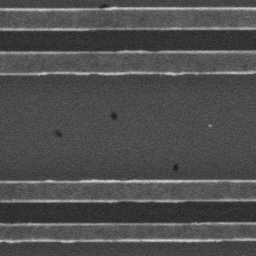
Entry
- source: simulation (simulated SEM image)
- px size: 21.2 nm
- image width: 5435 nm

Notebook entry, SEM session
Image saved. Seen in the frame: lines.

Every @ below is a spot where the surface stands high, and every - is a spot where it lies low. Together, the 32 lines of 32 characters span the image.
--------------------------------
@@@@@@@@@@@@@@@@@@@@@@@@@@@@@@@@
@@@@@@@@@@@@@@@@@@@@@@@@@@@@@@@@
@@@@@@@@@@@@@@@@@@@@@@@@@@@@@@@@
--------------------------------
--------------------------------
---------------@@@--@@@@@@@@@@@@
@@@@@@@@@@@@@@@@@@@@@@@@@@@@@@@@
@@@@@@@@@@@@@@@@@@@@@@@@@@@@@@@@
--------------------------------
--------------------------------
--------------------------------
--------------------------------
--------------------------------
--------------------------------
--------------------------------
--------------------------------
--------------------------------
--------------------------------
--------------------------------
--------------------------------
--------------------------------
--------------------------------
@@@@@@@@@@@@@@@@@@@@@@@@@@@@@@@@
@@@@@@@@@@@@@@@@@@@@@@@@@@@@@@@@
--------------------------------
--------------------------------
--------------------------------
@@@@@@@@@@@@@@@@@@@@@@@@@@@@@@@@
@@@@@@@@@@@@@@@@@@@@@@@@@@@@@@@@
--------------------------------
--------------------------------